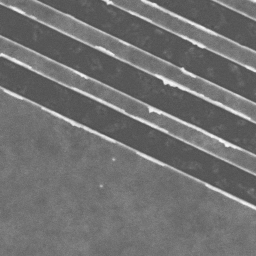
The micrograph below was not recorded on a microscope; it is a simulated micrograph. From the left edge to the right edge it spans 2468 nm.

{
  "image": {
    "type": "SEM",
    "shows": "parallel lines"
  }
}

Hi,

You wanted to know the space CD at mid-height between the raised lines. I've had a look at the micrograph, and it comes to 271 nanometres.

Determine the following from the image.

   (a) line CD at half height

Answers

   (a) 175 nm